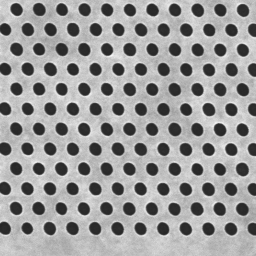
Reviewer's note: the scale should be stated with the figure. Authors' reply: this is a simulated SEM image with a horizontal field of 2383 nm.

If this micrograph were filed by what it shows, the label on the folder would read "a regular array of holes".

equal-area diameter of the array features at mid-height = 0.118 microns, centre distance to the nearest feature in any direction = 210 nanometres